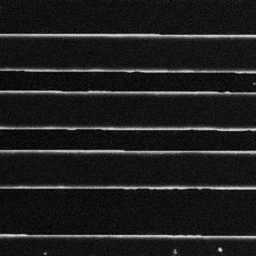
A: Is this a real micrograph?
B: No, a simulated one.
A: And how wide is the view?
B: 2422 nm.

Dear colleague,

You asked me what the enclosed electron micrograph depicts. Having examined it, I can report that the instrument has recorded lines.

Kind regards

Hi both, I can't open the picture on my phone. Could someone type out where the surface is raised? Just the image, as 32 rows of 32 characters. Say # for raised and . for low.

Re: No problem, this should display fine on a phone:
................................
................................
................................
................................
################################
################################
################################
################################
################################
................................
................................
#######.........................
################################
################################
################################
################################
................................
................................
................................
################################
################################
################################
################################
...........................##.##
................................
................................
................................
................................
................................
#####################...........
################################
################################